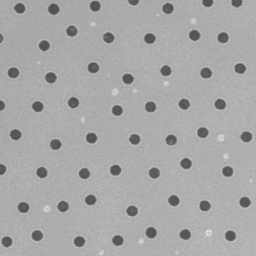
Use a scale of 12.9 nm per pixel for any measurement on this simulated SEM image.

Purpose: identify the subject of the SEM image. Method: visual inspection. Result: a regular array of holes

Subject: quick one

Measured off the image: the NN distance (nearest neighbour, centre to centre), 426 nm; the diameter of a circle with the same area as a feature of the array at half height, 159 nanometers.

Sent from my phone